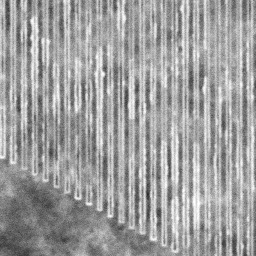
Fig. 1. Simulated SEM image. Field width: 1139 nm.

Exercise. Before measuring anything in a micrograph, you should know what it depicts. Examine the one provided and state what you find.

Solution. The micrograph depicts parallel lines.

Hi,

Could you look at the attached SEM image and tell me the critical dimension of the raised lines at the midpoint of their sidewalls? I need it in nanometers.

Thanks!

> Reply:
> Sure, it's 21.2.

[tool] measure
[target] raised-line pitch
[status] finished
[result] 47.9 nm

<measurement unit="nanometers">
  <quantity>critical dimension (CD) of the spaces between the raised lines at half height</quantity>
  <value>27.3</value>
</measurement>